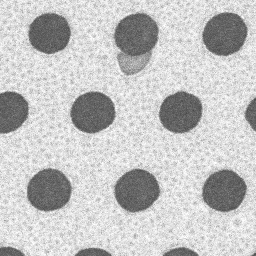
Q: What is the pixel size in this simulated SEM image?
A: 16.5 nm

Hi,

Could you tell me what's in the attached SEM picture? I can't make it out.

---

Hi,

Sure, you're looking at a regular array of holes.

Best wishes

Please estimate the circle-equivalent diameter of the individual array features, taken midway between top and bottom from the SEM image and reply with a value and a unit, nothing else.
0.726 micrometres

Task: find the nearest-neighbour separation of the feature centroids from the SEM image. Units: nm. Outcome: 1440